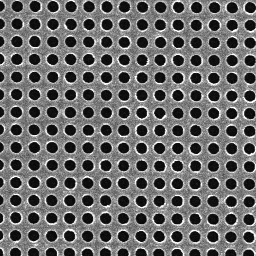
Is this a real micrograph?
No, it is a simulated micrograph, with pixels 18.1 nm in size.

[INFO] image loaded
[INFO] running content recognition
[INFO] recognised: a regular array of holes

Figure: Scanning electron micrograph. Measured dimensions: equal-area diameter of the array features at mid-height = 205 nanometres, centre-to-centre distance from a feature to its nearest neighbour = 318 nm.